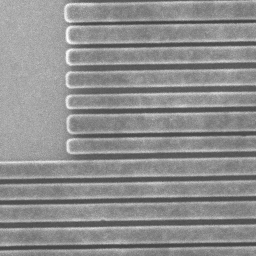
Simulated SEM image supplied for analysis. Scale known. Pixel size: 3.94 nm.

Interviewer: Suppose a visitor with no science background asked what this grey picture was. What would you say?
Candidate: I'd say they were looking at parallel lines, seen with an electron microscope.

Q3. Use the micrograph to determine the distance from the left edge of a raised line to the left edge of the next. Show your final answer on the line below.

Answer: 87.9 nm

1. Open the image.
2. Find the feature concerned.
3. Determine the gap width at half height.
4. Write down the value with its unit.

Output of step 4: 22.6 nanometers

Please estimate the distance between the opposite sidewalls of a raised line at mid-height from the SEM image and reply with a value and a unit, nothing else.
0.0674 micrometres